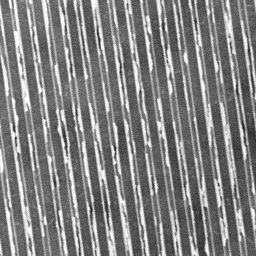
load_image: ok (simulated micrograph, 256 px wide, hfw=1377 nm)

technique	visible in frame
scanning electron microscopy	parallel lines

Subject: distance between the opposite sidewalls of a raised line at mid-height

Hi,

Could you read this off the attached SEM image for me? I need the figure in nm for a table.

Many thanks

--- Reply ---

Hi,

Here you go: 36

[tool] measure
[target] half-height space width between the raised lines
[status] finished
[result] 9.89 px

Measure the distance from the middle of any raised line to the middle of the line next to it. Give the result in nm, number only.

87